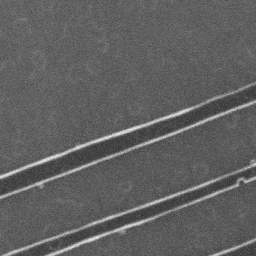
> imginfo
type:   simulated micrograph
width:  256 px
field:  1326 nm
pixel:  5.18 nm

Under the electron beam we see one or a few lines or trenches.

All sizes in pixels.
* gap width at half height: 57.1